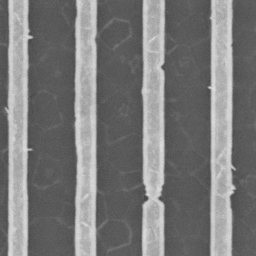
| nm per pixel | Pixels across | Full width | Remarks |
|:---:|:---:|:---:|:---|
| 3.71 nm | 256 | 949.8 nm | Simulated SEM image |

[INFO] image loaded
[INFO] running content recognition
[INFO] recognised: one or a few lines or trenches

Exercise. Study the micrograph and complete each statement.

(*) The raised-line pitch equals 251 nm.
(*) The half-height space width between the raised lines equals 188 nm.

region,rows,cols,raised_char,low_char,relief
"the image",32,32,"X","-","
-XX-------XX------XX-------XX---
-XX-------XX------XX-------XX---
-XX-------XX------XX-------XX---
-XX-------XX------XX-------XX---
-XX-------XX------XX-------XX---
-XX-------XX------XX-------XX---
-XX-------XX------XX-------XX---
-XX-------XX------XX-------XX---
-XX-------XX------XX-------XX---
-XX-------XX------XX-------XX---
-XX-------XX------XX-------XX---
-XX-------XX------XX-------XX---
-XX-------XX------XX-------XX---
-XX-------XX------XX-------XX---
-XX-------XX------XX-------XX---
-XX-------XX------XX-------XX---
-XX-------XX------XX-------XX---
-XX-------XX------XX-------XX---
-XX-------XX------XX-------XX---
-XX-------XX------XX-------XX---
-XX-------XX------XX-------XX---
-XX-------XX------XX-------XX---
-XX-------XX------XX-------XX---
-XX-------XX------XX-------XX---
-XX-------XX-------X-------XX---
-XX-------XX------XX-------XX---
-XX-------XX------XX-------XX---
-XX-------XX------XX-------XX---
-XX-------XX------XX-------XX---
-XX-------XX------XX-------XX---
-XX-------XX------XX-------XX---
-XX-------XX------XX-------XX---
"